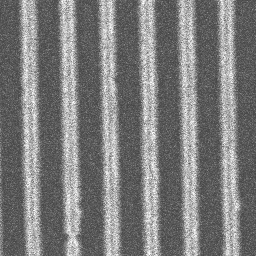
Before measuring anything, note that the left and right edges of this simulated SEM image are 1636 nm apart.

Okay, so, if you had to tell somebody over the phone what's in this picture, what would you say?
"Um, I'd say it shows parallel lines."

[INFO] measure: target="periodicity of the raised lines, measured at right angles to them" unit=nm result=253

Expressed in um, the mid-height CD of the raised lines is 0.0878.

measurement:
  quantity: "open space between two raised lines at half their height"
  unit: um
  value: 0.164